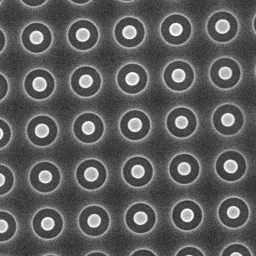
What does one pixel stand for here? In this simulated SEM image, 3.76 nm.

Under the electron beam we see an array of small figures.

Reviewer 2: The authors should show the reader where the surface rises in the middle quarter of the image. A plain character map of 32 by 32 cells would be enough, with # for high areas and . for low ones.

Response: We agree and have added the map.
#####.#########....#######......
###.....######......#####...#...
##.......####...##...####..###..
##..###..####...###..####..###..
##..###..####...##...####.......
##..##...#####......######......
##.......######.....#######...##
###.....#########.##############
################################
################################
################################
#################.#########.....
####....#######.....######......
###......#####.......#####...#..
###.......####..###...###...###.
##...###..####..###...####..##..
##...###..####...##..#####......
###...#...#####......######.....
###......#######....############
####....########################
################################
################################
#############################..#
#################...#######.....
####.....######......######.....
###.......#####...#...####...##.
###...##..#####..###..####...##.
###..###...####..###..####...##.
###..###...####.......#####.....
###.......######.....#######....
####.....########...############
######.#########################